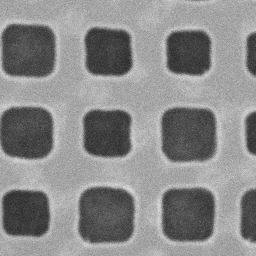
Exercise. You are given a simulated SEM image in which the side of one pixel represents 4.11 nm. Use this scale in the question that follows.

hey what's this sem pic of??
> holes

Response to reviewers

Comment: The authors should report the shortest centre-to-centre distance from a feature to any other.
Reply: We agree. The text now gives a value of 0.331 microns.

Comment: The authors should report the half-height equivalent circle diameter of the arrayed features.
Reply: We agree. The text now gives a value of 0.216 um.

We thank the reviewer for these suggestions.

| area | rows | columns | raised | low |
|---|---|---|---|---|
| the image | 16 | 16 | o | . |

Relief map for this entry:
oooooooooooooooo
oooooooooooooooo
...oo...oo...oo.
....o...oo...oo.
...ooo..ooo..ooo
oooooooooooooooo
oooooooooooooooo
...oo...oo....o.
...oo...oo....o.
...ooo..oo...ooo
oooooooooooooooo
oooooooooooooooo
...oo...oo...oo.
...oo...oo...oo.
...oo...oo...oo.
oooooooooooooooo